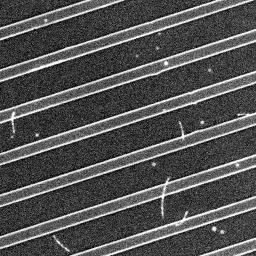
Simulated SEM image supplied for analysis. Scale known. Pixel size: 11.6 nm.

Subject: parallel lines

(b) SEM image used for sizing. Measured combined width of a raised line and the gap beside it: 462 nanometres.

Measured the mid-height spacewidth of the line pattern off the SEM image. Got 332 nanometers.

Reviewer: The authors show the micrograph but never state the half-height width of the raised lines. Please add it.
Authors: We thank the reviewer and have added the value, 130 nanometers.